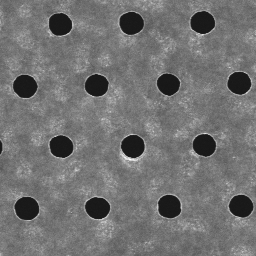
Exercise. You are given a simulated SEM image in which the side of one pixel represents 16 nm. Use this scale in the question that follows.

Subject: a regular array of holes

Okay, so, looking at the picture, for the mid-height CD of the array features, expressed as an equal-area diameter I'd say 375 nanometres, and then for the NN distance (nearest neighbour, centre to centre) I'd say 1130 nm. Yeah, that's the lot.